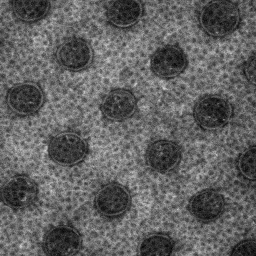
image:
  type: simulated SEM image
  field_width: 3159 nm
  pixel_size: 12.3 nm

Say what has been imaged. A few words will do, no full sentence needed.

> a regular array of raised bodies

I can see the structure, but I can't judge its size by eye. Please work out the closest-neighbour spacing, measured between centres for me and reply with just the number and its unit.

816 nm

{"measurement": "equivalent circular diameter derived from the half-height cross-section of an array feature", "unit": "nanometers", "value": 392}